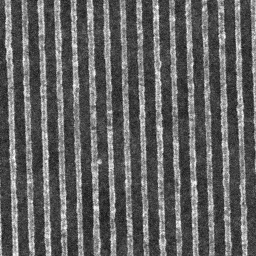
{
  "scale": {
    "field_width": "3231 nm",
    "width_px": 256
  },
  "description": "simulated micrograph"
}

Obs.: parallel lines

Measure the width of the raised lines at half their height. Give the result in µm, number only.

0.0583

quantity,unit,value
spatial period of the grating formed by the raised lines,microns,0.207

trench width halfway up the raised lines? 0.145 um